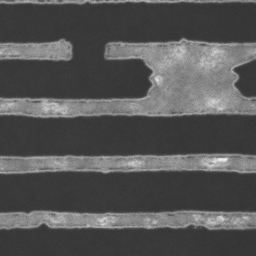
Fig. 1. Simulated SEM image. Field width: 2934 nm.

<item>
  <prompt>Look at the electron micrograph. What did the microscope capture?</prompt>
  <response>parallel lines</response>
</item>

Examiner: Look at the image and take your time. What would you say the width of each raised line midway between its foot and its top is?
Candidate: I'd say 491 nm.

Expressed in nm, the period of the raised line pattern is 646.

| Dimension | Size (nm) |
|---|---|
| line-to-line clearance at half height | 149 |